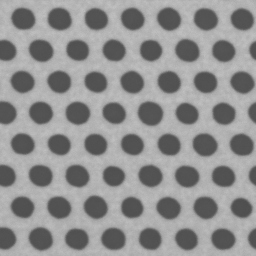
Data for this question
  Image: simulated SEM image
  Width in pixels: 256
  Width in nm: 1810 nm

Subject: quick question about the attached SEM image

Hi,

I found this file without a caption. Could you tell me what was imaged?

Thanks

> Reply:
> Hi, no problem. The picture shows a regular array of holes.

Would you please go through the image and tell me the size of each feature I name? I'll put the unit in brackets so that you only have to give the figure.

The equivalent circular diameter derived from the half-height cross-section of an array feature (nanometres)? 160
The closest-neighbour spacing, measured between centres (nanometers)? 255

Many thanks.